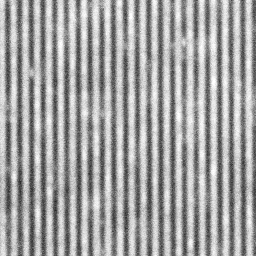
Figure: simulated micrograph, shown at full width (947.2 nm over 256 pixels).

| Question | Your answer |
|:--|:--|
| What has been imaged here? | parallel lines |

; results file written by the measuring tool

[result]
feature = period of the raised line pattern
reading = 43.4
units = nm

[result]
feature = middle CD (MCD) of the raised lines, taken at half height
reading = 18.9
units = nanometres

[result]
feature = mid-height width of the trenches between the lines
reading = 23.6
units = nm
